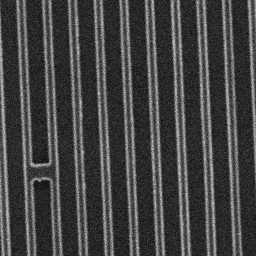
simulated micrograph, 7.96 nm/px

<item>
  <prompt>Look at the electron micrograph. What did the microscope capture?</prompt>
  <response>parallel lines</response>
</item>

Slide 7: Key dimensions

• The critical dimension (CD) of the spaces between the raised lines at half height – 152 nanometres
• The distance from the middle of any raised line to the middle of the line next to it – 204 nm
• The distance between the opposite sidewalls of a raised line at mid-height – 53.7 nm